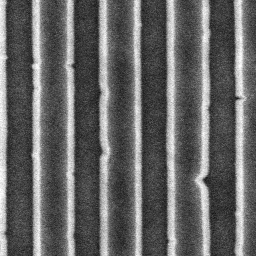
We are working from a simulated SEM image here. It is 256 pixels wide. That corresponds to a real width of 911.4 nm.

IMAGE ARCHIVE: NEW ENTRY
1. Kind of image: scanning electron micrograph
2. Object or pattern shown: one or a few lines or trenches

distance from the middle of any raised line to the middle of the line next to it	239	nanometres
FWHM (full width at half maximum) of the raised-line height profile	129	nm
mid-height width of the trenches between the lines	31.1	px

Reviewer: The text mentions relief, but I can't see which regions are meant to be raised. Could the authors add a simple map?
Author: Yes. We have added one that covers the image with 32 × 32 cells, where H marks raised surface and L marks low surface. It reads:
LLLLHHHHHLLLLHHHHLLLLHHHHHLLLLHH
LLLLHHHHHLLLLHHHHLLLLHHHHHLLLLHH
LLLLHHHHHLLLLHHHHLLLLHHHHHLLLLHH
LLLLHHHHHLLLLHHHHLLLLHHHHHLLLLHH
LLLLHHHHHLLLLHHHHLLLLHHHHHLLLLHH
LLLLHHHHHLLLLHHHHLLLLHHHHHLLLLHH
LLLLHHHHHLLLLHHHHLLLLHHHHHLLLLHH
LLLLHHHHHLLLLHHHHLLLLHHHHHLLLLHH
LLLLHHHHHLLLLHHHHLLLLHHHHHLLLLHH
LLLLHHHHHLLLLHHHHLLLLHHHHHLLLLHH
LLLLLHHHHLLLLHHHHLLLLHHHHHLLLLHH
LLLLLHHHHLLLLHHHHLLLLHHHHHLLLLHH
LLLLLHHHHLLLLHHHHLLLLHHHHHLLLLHH
LLLLLHHHHLLLLHHHHLLLLHHHHHLLLLHH
LLLLLHHHHLLLLHHHHLLLLHHHHHLLLLHH
LLLLHHHHHLLLLHHHHLLLLHHHHHLLLLHH
LLLLLHHHHLLLLHHHHLLLLHHHHHLLLLHH
LLLLLHHHHLLLLHHHHLLLLHHHHHLLLLHH
LLLLLHHHHLLLLHHHHLLLLHHHHHLLLLHH
LLLLHHHHHLLLLHHHHLLLLHHHHHLLLLHH
LLLLLHHHHLLLLHHHHLLLLHHHHHLLLLHH
LLLLLHHHHLLLLHHHHLLLLHHHHHLLLLHH
LLLLLHHHHLLLLHHHHLLLLHHHHLLLLLHH
LLLLLHHHHLLLLHHHHLLLLHHHHHLLLLHH
LLLLLHHHHLLLLHHHHLLLLHHHHHLLLLHH
LLLLLHHHHLLLLHHHHLLLLHHHHHLLLLHH
LLLLLHHHHLLLLHHHHLLLLHHHHHLLLLHH
LLLLLHHHHLLLLHHHHLLLLHHHHHLLLLHH
LLLLLHHHHLLLLHHHHLLLLHHHHHLLLLHH
LLLLLHHHHLLLLHHHHLLLLHHHHHLLLLHH
LLLLLHHHHLLLLHHHHLLLLHHHHHLLLLHH
LLLLLHHHHLLLLHHHHLLLLHHHHHLLLLHH